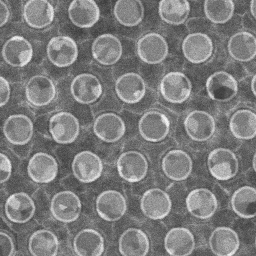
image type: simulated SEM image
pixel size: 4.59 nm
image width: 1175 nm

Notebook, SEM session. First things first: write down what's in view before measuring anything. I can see a regular array of raised bodies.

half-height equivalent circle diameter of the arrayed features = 132 nanometers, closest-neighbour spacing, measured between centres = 44.4 px